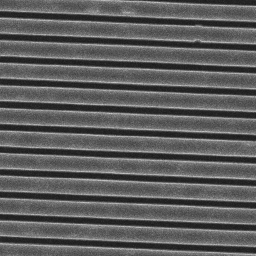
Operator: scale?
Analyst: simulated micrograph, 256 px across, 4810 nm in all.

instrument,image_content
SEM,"parallel lines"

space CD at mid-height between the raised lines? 6.99 pixels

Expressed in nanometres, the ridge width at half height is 300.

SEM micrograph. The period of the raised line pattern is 423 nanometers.